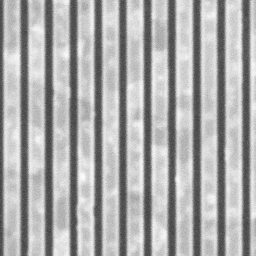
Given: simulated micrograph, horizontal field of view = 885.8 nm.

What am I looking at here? parallel lines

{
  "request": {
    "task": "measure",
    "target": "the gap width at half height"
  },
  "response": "34.1 nanometers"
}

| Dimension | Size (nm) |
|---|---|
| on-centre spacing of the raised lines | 85.2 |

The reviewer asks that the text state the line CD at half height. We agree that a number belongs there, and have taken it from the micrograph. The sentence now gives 0.0527 microns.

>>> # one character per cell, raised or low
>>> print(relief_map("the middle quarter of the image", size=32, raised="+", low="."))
+...+++...+++...++++..++++..++++
+...+++...+++...++++..++++..++++
+...+++...+++...++++..++++..++++
+...+++...+++...++++..++++..++++
+...+++...+++...++++..++++..++++
+...+++...+++...++++..++++..++++
+...+++...+++...++++..++++..++++
+...+++...+++...++++..++++..++++
+...+++...+++...++++..++++..++++
+...+++...+++...++++..++++..++++
+...+++...+++...++++..++++..++++
+...+++...+++...++++..++++..++++
+...+++...+++...++++..++++..++++
+...+++...+++...++++..++++..++++
+...+++...+++...++++..++++..++++
+...+++...+++...++++..++++..++++
+...+++...+++...++++..++++..++++
+...+++...+++...++++..++++..++++
+...+++...+++...++++..++++..++++
+...+++...+++...++++..++++..++++
+...+++...+++...++++..++++..++++
+...+++...+++...++++..++++..++++
+...+++...+++...++++..++++..++++
+...+++...+++...++++..++++..++++
+...+++...+++...++++..++++..++++
+...+++...+++...++++..++++..++++
+...+++...+++...++++..++++..++++
+...+++...+++...++++..++++..++++
+...+++...+++...++++..++++..++++
+...+++...+++...++++..++++..++++
+...+++...+++...++++..++++..++++
+...+++...+++...++++..++++..++++